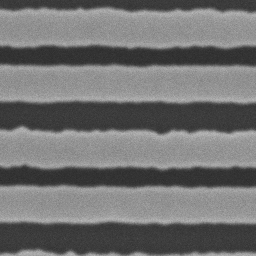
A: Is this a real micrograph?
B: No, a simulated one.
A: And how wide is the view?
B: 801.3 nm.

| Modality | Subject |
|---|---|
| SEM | lines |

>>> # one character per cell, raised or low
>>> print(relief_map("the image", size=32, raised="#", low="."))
................................
################.###.##########.
################################
################################
################################
################################
................................
................................
################################
################################
################################
################################
################################
................................
................................
................................
######..###########..##.###..###
################################
################################
################################
################################
................................
................................
################################
################################
################################
################################
################################
................................
................................
................................
..####..........................